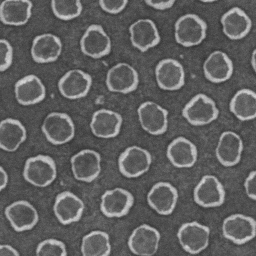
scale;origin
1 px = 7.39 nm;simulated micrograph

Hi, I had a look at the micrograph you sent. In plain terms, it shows a regular array of raised bodies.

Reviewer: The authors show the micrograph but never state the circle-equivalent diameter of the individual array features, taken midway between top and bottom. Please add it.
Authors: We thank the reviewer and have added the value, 28.5 px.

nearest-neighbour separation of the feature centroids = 0.339 micrometres